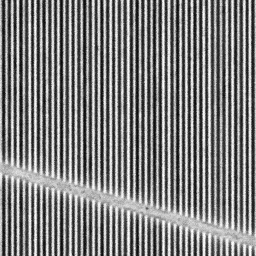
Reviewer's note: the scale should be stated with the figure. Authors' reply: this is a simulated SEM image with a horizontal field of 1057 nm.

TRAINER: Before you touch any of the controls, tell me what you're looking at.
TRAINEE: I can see parallel lines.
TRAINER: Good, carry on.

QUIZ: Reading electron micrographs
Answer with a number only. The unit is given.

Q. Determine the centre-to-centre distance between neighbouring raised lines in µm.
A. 0.0239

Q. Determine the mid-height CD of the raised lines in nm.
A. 7.7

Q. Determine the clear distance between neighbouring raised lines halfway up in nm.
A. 15.5